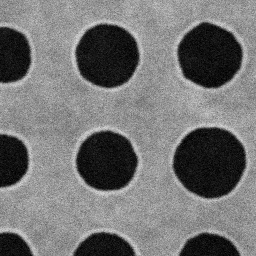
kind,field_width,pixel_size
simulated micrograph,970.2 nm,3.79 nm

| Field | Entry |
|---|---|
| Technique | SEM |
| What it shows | holes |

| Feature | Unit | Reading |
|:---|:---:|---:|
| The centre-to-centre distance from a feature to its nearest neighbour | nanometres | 389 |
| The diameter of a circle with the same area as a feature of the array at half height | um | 0.254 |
